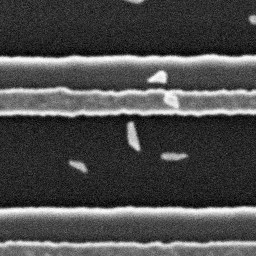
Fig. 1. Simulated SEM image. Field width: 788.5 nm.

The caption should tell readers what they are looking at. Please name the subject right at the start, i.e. lines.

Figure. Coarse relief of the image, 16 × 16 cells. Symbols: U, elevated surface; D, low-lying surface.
DDDDDDDDDDDDDDDD
DDDDDDDDDDDDDDDD
DDDDDDDDDDDDDDDD
DDDDDDDDDDDDDDDD
UUUUUUUUUUUUUUUU
UUUUUUUUUUUUUUUU
UUUUUUUUUUUUUUUU
DDDDDDDDDDDDDDDD
DDDDDDDDDDDDDDDD
DDDDDDDDDDDDDDDD
DDDDDDDDDDDDDDDD
DDDDDDDDDDDDDDDD
DDDDDDDDDDDDDDDD
UUUUUUUUUUUUUUUU
UUUUUUUUUUUUUUUU
UUUUUUUUUUUUUUUU